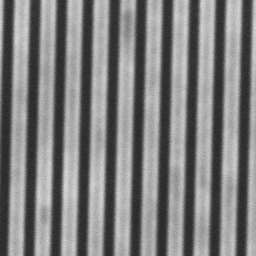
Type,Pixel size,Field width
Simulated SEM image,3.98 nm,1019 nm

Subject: parallel lines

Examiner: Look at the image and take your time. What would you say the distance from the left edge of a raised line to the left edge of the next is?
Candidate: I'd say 105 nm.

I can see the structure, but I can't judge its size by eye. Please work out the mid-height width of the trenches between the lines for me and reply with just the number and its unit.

11.7 pixels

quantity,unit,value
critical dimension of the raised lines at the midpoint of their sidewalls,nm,58.1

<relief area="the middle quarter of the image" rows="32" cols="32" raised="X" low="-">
-XXX---XXXX---XXX---XXXX---XXXX-
-XXX---XXXX---XXX---XXXX---XXXX-
-XXX---XXXX---XXX---XXXX---XXX--
-XXX---XXXX---XXX---XXXX---XXX--
-XXX---XXXX---XXX---XXXX---XXX--
-XXX---XXXX---XXX---XXXX---XXX--
-XXX---XXXX---XXX---XXXX---XXX--
-XXX---XXXX---XXX---XXXX---XXX--
-XXX---XXXX---XXX---XXXX---XXX--
XXXX---XXXX---XXX---XXXX---XXX--
XXXX---XXX----XXX---XXXX---XXX--
XXXX---XXX----XXX---XXXX---XXX--
XXXX---XXX----XXX---XXXX---XXX--
XXXX---XXX----XXX---XXXX---XXX--
XXXX---XXX----XXX---XXXX---XXX--
XXXX---XXX----XXX---XXXX---XXX--
XXXX---XXX----XXX---XXXX---XXX--
XXXX---XXX---XXXX---XXXX---XXX--
XXXX---XXX---XXXX---XXX----XXX--
XXXX---XXX---XXXX---XXX----XXX--
XXXX---XXX---XXXX---XXX----XXX--
XXXX---XXX---XXXX---XXX----XXX--
XXXX---XXX---XXXX---XXX----XXX--
XXXX---XXX---XXXX---XXX----XXX--
XXXX---XXX---XXXX---XXX----XXX--
XXXX---XXX---XXXX---XXX---XXXX--
XXX----XXX---XXXX---XXX---XXXX--
XXX----XXX---XXXX---XXX---XXXX--
XXX----XXX---XXXX---XXX---XXXX--
XXX----XXX---XXXX---XXX---XXXX--
XXX----XXX---XXXX---XXX---XXXX--
XXX----XXX---XXXX---XXX---XXXX--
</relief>